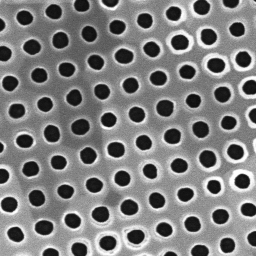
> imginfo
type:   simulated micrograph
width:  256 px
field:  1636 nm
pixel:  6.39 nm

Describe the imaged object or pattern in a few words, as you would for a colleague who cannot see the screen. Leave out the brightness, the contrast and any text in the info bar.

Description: a regular array of holes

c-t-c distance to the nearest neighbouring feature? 0.183 micrometres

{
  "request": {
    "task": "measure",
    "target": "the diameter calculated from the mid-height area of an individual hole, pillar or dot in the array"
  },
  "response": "102 nm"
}